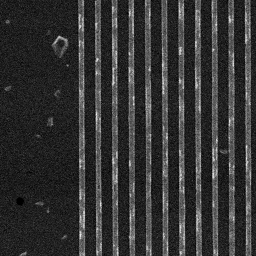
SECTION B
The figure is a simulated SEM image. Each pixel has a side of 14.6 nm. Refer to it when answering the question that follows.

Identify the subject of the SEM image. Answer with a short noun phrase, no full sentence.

parallel lines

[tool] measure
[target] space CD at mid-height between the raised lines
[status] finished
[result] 176 nm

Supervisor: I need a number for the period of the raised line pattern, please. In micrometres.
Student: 0.243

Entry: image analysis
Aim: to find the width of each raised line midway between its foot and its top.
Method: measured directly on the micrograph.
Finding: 69.5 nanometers